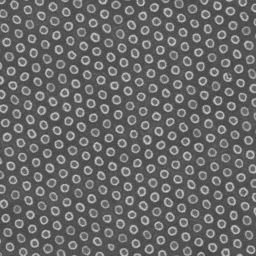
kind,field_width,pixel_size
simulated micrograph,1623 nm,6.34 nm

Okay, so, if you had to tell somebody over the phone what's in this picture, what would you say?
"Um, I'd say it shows a regular array of raised bodies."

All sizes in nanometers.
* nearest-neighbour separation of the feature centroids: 89.4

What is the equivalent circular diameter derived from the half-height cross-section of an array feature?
50.6 nanometers